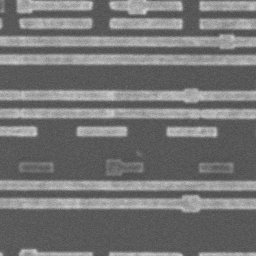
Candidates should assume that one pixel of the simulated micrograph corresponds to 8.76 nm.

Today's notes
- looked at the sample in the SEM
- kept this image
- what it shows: wiring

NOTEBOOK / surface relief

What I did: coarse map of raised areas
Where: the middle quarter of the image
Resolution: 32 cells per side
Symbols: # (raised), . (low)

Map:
................................
................................
................................
................................
................................
................................
................................
################################
################################
................................
................................
##############################..
################################
................................
................................
................................
...############...........######
...############...........######
................................
................................
................................
................................
................................
................................
...........###..................
...........#########............
...........#########............
...........###..................
................................
################################
################################
................................